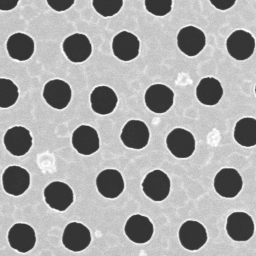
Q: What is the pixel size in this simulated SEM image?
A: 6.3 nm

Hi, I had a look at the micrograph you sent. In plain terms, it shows a regular array of holes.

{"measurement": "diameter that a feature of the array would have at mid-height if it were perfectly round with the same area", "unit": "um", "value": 0.181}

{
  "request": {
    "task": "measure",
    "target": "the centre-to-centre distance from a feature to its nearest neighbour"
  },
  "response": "291 nanometers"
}